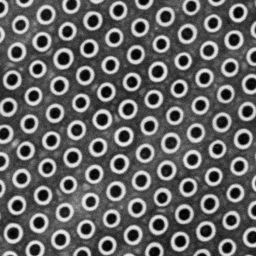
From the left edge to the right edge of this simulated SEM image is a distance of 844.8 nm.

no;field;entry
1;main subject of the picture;a regular array of ring-shaped raised bodies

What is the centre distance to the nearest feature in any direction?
26.9 pixels